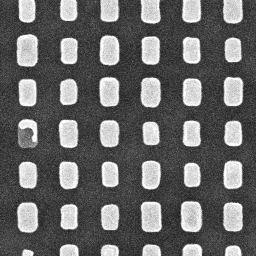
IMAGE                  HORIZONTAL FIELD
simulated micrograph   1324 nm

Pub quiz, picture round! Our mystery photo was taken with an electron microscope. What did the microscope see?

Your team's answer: a regular array of raised bodies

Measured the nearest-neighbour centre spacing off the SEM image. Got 0.212 micrometres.